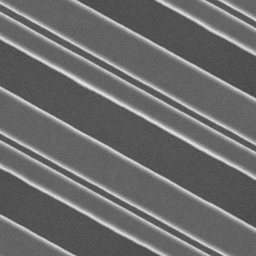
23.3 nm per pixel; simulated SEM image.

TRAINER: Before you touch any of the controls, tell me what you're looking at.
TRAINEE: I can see lines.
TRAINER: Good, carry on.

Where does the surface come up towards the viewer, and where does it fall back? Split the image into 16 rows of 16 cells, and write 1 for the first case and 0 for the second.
1111110000011111
1111111000000111
1111111110000011
0011111111100000
0000111111111000
0000001111111110
1100000011111111
1111000001111111
1111100000011111
1111111000000111
1111111110000001
0011111111100000
0000111111111000
0000001111111100
1100000111111111
1111000001111111